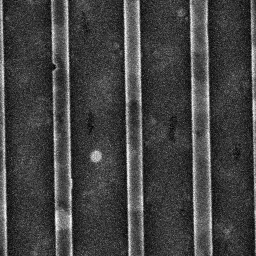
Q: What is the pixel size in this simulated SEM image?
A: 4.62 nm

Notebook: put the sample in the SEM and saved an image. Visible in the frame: one or a few lines or trenches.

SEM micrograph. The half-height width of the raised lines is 71.1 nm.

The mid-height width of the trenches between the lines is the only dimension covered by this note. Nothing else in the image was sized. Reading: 236 nm